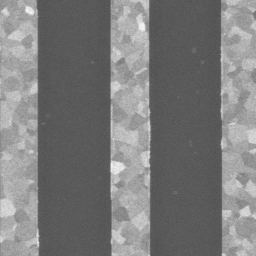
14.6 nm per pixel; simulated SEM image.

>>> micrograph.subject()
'lines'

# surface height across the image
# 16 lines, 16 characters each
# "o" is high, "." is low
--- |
oo.....oo.....oo
oo.....oo.....oo
oo.....oo.....oo
oo.....oo.....oo
oo.....oo.....oo
oo.....oo.....oo
oo.....oo.....oo
oo.....oo.....oo
oo.....oo.....oo
oo.....oo.....oo
oo.....oo.....oo
oo.....oo.....oo
oo.....oo.....oo
oo.....oo.....oo
oo.....oo.....oo
oo.....oo.....oo